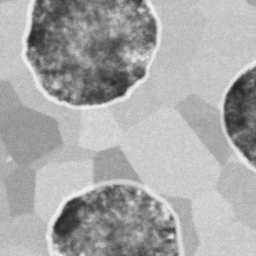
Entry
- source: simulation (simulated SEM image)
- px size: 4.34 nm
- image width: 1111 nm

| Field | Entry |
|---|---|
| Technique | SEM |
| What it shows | holes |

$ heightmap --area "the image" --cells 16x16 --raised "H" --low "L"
HHLLLLLLLHHHHHHH
HHLLLLLLLLHHHHHH
HHLLLLLLLLHHHHHH
HHLLLLLLLLHHHHHH
HHLLLLLLLHHHHHHL
HHHLLLLLHHHHHHLL
HHHHLLLHHHHHHHLL
HHHHHHHHHHHHHHLL
HHHHHHHHHHHHHHLL
HHHHHHHHHHHHHHHL
HHHHHHHHHHHHHHHH
HHHHHHLLHHHHHHHH
HHHHLLLLLLHHHHHH
HHHLLLLLLLLHHHHH
HHHLLLLLLLLHHHHH
HHHLLLLLLLLHHHHH